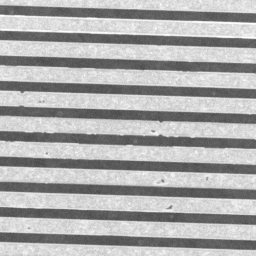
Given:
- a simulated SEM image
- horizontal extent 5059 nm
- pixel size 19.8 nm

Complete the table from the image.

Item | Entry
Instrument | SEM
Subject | parallel lines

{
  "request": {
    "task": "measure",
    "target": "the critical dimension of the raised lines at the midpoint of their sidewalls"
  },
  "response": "0.286 um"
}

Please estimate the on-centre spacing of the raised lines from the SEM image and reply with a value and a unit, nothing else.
498 nm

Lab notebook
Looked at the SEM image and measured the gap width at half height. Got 220 nanometers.